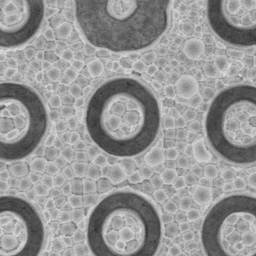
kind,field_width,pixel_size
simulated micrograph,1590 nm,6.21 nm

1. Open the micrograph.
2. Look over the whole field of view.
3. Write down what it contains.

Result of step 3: ring-shaped grooves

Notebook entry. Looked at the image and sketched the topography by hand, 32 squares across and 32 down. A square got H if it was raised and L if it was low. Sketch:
HHHLLLHHHLLLLLHHHLLLLHHHHHLLHHHH
HHHHLHHHHLLLLLHHLLLLLHHHHHLLHHHH
HHHLLHHHHHLLLLLLLLLLLHHHHHLLHHHH
HHLLLHHHHHLLLLLLLLLLLHHHHHHLLLLL
LLLLHHHHHHLLLLLLLLLLHHHHHHHLLLLL
LLLHHHHHHHHLLLLLLLLHHHHHHHHHHLLL
HHHHHHHHHHHHHHLLHHHHHHHHHHHHHHHH
HHHHHHHHHHHHHHHHHHHHHHHHHHHHHHHH
HHHHHHHHHHHHHHHHHHHHHHHHHHHHHHHH
HHHHHHHHHHHHHHHHHHHHHHHHHHHHHHHH
LLHHHHHHHHHHHLLLLLHHHHHHHHHHHHHH
LLLLHHHHHHHHLLLLLLLHHHHHHHHLLLLL
HHLLLHHHHHHLLLHHHLLLHHHHHHHLLLLL
HHHLLLHHHHHLLHHHHHLLHHHHHHLLLHHH
HHHHLLHHHHHLLHHHHHLLHHHHHHLLHHHH
HHHHLLHHHHHLLHHHHHLLHHHHHHLLHHHH
HHHLLLHHHHHLLHHHHLLLHHHHHHLLHHHH
HHLLLHHHHHHHLLLLLLLHHHHHHHLLLHHH
LLLLHHHHHHHHHLLLLLHHHHHHHHHLLLLL
LLLHHHHHHHHHHHHLHHHHHHHHHHHHLLLL
HHHHHHHHHHHHHHHHHHHHHHHHHHHHHHHH
HHHHHHHHHHHHHHHHHHHHHHHHHHHHHHHH
HHHHHHHHHHHHHHHHHHHHHHHHHHHHHHHH
HHHHHHHHHHHHHHHHHHHHHHHHHHHHHHHH
LLHHHHHHHHHHHLLLLLHHHHHHHHHHHLHH
LLLLHHHHHHHHLLLLLLLHHHHHHHHLLLLL
LLLLLHHHHHHHLLHHLLLHHHHHHHLLLLLL
HHHLLHHHHHHLLHHHHLLLHHHHHHLLHHHH
HHHLLHHHHHHLLHHHHHLLHHHHHLLLHHHH
HHHLLLHHHHHLLHHHHHLLHHHHHLLLHHHH
HHHLLHHHHHHLLHHHHHLLHHHHHLLLHHHH
HHLLLHHHHHHHLLLHHLLHHHHHHHLLHHHH